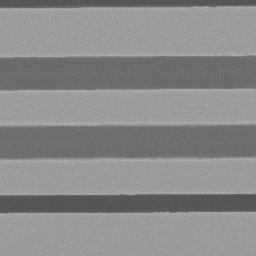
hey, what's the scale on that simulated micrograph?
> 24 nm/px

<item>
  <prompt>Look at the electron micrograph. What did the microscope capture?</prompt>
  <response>lines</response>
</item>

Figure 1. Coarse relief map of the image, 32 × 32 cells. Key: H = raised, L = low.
LLLLLLLLLLLLLLLLLLLLLLLLLLLLLLLL
HHHHHHHHHHHHHHHHHHHHHHHHHHHHHHHH
HHHHHHHHHHHHHHHHHHHHHHHHHHHHHHHH
HHHHHHHHHHHHHHHHHHHHHHHHHHHHHHHH
HHHHHHHHHHHHHHHHHHHHHHHHHHHHHHHH
HHHHHHHHHHHHHHHHHHHHHHHHHHHHHHHH
HHHHHHHHHHHHHHHHHHHHHHHHHHHHHHHH
LLLLLLLLLLLLLLLLLLLLLLLLLLLLLLLL
LLLLLLLLLLLLLLLLLLLLLLLLLLLLLLLL
LLLLLLLLLLLLLLLLLLLLLLLLLLLLLLLL
LLLLLLLLLLLLLLLLLLLLLLLLLLLLLLLL
HHHHHHHHHHHHHHHHHHHHHHHHHHHHHHHH
HHHHHHHHHHHHHHHHHHHHHHHHHHHHHHHH
HHHHHHHHHHHHHHHHHHHHHHHHHHHHHHHH
HHHHHHHHHHHHHHHHHHHHHHHHHHHHHHHH
LLLLLLLLLLLLLLLLLLLLLLLLLLLLLLLL
LLLLLLLLLLLLLLLLLLLLLLLLLLLLLLLL
LLLLLLLLLLLLLLLLLLLLLLLLLLLLLLLL
LLLLLLLLLLLLLLLLLLLLLLLLLLLLLLLL
LLLLLLLLLLLLLLLLLLLLLLLLLLLLLLLL
HHHHHHHHHHHHHHHHHHHHHHHHHHHHHHHH
HHHHHHHHHHHHHHHHHHHHHHHHHHHHHHHH
HHHHHHHHHHHHHHHHHHHHHHHHHHHHHHHH
HHHHHHHHHHHHHHHHHHHHHHHHHHHHHHHH
LLLLLLLLLLLLLLLLLLLLLLLLLLLLLLLL
LLLLLLLLLLLLLLLLLLLLLLLLLLLLLLLL
LLLLLLLLLLLLLLLLLLLLLLLLLLLLLLLL
HHHHHHHHHHHHHHHHHHHHHHHHHHHHHHHH
HHHHHHHHHHHHHHHHHHHHHHHHHHHHHHHH
HHHHHHHHHHHHHHHHHHHHHHHHHHHHHHHH
HHHHHHHHHHHHHHHHHHHHHHHHHHHHHHHH
HHHHHHHHHHHHHHHHHHHHHHHHHHHHHHHH